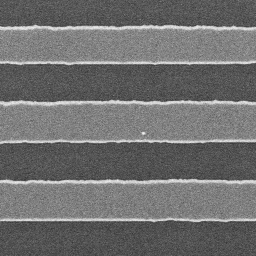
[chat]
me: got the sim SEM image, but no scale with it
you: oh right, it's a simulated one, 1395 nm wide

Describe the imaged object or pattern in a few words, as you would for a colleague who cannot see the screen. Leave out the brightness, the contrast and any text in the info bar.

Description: lines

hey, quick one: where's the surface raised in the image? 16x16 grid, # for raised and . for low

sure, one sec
................
................
################
################
................
................
################
################
################
................
................
################
################
################
................
................